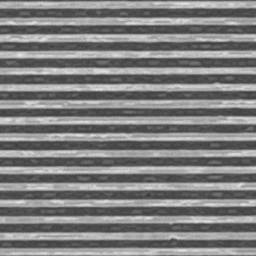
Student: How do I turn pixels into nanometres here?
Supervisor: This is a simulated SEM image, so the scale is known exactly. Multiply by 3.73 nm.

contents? parallel lines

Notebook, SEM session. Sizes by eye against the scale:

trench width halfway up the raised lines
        0.035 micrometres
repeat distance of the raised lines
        61.5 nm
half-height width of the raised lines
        24.3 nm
